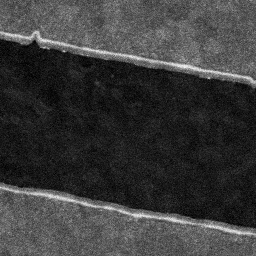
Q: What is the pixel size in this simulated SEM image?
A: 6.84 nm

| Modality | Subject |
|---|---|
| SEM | one or a few lines or trenches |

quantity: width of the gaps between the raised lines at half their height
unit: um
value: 1.04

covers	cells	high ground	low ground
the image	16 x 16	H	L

HHHHHHHHHHHHHHHH
HHHHHHHHHHHHHHHH
LLLHHHHHHHHHHHHH
LLLLLLLLHHHHHHHH
LLLLLLLLLLLLLHHH
LLLLLLLLLLLLLLLL
LLLLLLLLLLLLLLLL
LLLLLLLLLLLLLLLL
LLLLLLLLLLLLLLLL
LLLLLLLLLLLLLLLL
LLLLLLLLLLLLLLLL
LLLLLLLLLLLLLLLL
HHHHLLLLLLLLLLLL
HHHHHHHHHLLLLLLL
HHHHHHHHHHHHHHHL
HHHHHHHHHHHHHHHH